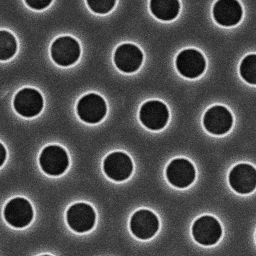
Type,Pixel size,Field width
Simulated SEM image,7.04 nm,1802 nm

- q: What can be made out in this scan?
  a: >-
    a regular array of holes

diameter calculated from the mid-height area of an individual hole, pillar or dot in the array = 216 nm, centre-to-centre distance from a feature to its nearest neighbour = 442 nanometres